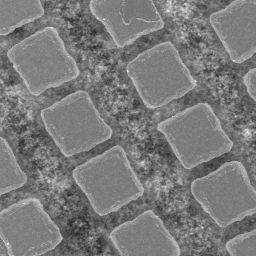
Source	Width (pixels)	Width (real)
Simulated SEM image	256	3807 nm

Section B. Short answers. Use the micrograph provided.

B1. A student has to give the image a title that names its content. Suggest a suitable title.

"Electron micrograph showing raised bodies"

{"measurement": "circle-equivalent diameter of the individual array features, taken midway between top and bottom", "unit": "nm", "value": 904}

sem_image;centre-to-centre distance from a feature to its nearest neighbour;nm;1050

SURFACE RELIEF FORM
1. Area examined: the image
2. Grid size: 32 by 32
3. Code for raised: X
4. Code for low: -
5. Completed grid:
XXXXX------XXXXXXXX----------XXX
XXXXX-------XXXXXXXX-------XXXXX
XXXX--------XXXXXXXX------XXXXXX
XX-----------XXXXXXX-------XXXXX
----XXX-------XXX----------XXXXX
--XXXXXX-------X----X-------XXXX
-XXXXXXX----------XXXX-------XXX
-XXXXXXXX--------XXXXXX------X--
--XXXXXXXX------XXXXXXX---------
---XXXXXX-------XXXXXXXX-------X
---XXXXX---------XXXXXXX-------X
----X-----X------XXXXXXX-------X
--------XXX-------XXXX----------
------XXXXXX------------XX------
-----XXXXXXXX---------XXXXX-----
------XXXXXXX-------XXXXXXX-----
------XXXXXXXX------XXXXXXXX----
X------XXXXXX--------XXXXXXXX---
X------XXXXX--X-------XXXXXXX---
XX----------XXXX------XXXXX-----
XX--------XXXXXX-------XX---XX--
XXX------XXXXXXXX----------XXXX-
XXX------XXXXXXXX-------XXXXXXX-
XX--------XXXXXXXX------XXXXXXXX
-----------XXXXXXX------XXXXXXXX
--XXX------XXXXX---------XXXXXXX
XXXXXX------XX----X-------XXXXXX
XXXXXX-----------XXX-------XXX--
XXXXXXX--------XXXXXX-----------
XXXXXXXX------XXXXXXX---------XX
-XXXXXX-------XXXXXXXX------XXXX
-XXXXX---------XXXXXXX-------XXX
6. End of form